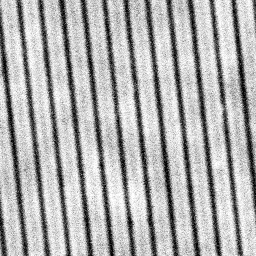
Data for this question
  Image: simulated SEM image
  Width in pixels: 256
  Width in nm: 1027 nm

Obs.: parallel lines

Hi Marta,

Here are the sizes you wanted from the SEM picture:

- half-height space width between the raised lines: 6.21 px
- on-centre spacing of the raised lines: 85.4 nm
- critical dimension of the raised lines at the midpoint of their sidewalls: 60.8 nm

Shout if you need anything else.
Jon